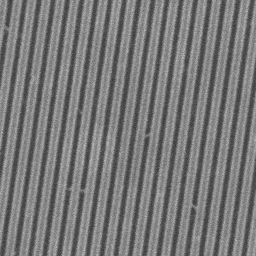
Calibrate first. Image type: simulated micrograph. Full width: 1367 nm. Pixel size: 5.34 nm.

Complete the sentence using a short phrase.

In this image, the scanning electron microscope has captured parallel lines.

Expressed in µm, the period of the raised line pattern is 0.0752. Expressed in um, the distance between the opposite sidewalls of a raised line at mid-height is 0.0376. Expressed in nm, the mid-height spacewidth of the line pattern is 37.6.